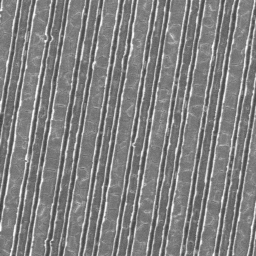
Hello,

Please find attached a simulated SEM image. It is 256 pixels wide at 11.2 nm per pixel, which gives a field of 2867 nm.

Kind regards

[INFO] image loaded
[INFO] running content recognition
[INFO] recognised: parallel lines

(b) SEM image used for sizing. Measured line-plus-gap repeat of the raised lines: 186 nanometers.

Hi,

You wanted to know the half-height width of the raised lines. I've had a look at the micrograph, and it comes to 62.2 nanometres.